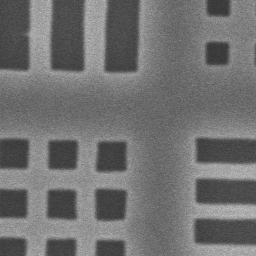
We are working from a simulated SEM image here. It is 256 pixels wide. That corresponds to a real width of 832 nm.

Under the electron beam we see groups of lines, slits or small figures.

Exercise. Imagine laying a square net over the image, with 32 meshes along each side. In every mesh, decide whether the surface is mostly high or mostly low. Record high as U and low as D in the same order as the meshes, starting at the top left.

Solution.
DDDDUUDDDDDUUDDDDDUUUUUUUUDDDUUU
DDDDUUDDDDDUUDDDDUUUUUUUUUDDDUUU
DDDDUUDDDDDUUDDDDUUUUUUUUUUUUUUU
DDDDUUDDDDDUUDDDDUUUUUUUUUUUUUUU
DDDDUUDDDDDUUDDDDUUUUUUUUUUUUUUU
DDDDUUDDDDDUUDDDDUUUUUUUUUDDUUUU
DDDDUUDDDDDUUDDDDUUUUUUUUUDDDUUU
DDDDUUDDDDDUUDDDDUUUUUUUUUDDDUUU
DDDDUUDDDDDUUDDDDUUUUUUUUUUUUUUU
UUUUUUUUUUUUUUUUUUUUUUUUUUUUUUUU
UUUUUUUUUUUUUUUUUUUUUUUUUUUUUUUU
UUUUUUUUUUUUUUUUUUUUUUUUUUUUUUUU
UUUUUUUUUUUUUUUUUUUUUUUUUUUUUUUU
UUUUUUUUUUUUUUUUUUUUUUUUUUUUUUUU
UUUUUUUUUUUUUUUUUUUUUUUUUUUUUUUU
UUUUUUUUUUUUUUUUUUUUUUUUUUUUUUUU
UUUUUUUUUUUUUUUUUUUUUUUUUUUUUUUU
DDDUUUUDDUUUUUUUUUUUUUUUDDDDDDDD
DDDDUUDDDDUUDDDDUUUUUUUUDDDDDDDD
DDDDUUDDDDUUDDDDUUUUUUUUDDDDDDDD
DDDDUUDDDDUUDDDDUUUUUUUUUDDDDDDD
UUUUUUUUUUUUDDDUUUUUUUUUUUUUUUUU
UUUUUUUUUUUUUUUUUUUUUUUUUDDDDDDD
UUUUUUUUUUUUUUUUUUUUUUUUDDDDDDDD
DDDUUUDDDDUUDDDDUUUUUUUUDDDDDDDD
DDDUUUDDDDUUDDDDUUUUUUUUUDDDDDDD
DDDUUUDDDDUUDDDDUUUUUUUUUUUUUUUU
UUUUUUUUUUUUDDDUUUUUUUUUDDDDDDDD
UUUUUUUUUUUUUUUUUUUUUUUUDDDDDDDD
UUUUUUUUUUUUUUUUUUUUUUUUDDDDDDDD
DDDUUUDDDDUUDDDDUUUUUUUUUDDDDDDD
DDDUUUDDDDUUDDDDUUUUUUUUUUUUUUUU